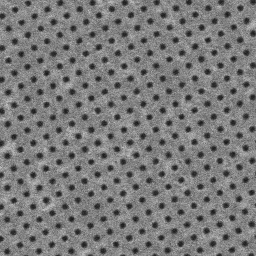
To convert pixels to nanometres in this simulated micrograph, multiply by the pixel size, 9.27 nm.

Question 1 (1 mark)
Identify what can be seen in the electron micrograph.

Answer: a regular array of holes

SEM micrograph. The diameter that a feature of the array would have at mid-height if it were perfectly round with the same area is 62.8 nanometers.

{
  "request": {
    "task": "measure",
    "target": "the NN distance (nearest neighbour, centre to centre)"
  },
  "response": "129 nanometres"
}